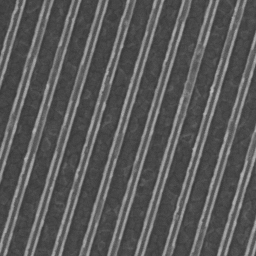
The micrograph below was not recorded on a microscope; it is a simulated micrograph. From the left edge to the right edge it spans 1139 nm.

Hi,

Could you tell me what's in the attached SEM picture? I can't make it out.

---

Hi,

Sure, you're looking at parallel lines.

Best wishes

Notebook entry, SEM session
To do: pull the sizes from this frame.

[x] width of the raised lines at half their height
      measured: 0.0379 micrometres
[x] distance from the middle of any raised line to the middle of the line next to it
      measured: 118 nm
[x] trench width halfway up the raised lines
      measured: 80.1 nm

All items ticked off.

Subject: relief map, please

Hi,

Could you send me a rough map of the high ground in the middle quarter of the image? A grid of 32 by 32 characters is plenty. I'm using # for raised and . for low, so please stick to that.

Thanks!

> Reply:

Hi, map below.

....##.....##.....##.....##.....
....##.....##.....##.....##.....
...###....###....###....##.....#
...##.....##.....##.....##.....#
...##.....##.....##.....##.....#
...##....###....###....##.....##
..##.....##.....##.....##.....##
..##.....##.....##.....##.....##
..##.....##....###.....##....##.
.###....##.....###....##.....##.
.##.....##.....##.....##.....##.
.##.....##.....##.....##....###.
###.....##....##.....##.....##..
##.....##.....##.....##.....##..
##.....##.....##.....##....###..
##....###.....##.....#.....##...
#.....###....###....##.....##...
#.....##.....##.....##.....##...
#.....##.....##....###.....#....
#....##.....##.....##.....##....
.....##.....##.....##.....##....
.....##.....##.....##....###....
....###....###....##.....##.....
....##.....##.....##.....##.....
....##.....##.....##.....##.....
....##....###.....##....##.....#
...##.....##.....##.....##.....#
...##.....##.....##.....##.....#
...##.....##.....##.....##....##
...##.....#.....##.....##.....##
..##.....##.....##.....##.....##
..##.....##.....##....###.....##